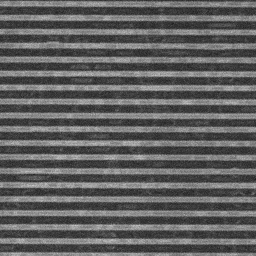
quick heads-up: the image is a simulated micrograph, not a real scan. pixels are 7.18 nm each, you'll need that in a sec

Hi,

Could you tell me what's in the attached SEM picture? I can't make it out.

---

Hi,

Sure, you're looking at parallel lines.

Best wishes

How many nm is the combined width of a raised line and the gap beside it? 100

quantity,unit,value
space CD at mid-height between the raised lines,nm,61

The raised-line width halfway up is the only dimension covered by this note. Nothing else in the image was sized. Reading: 34.1 nm